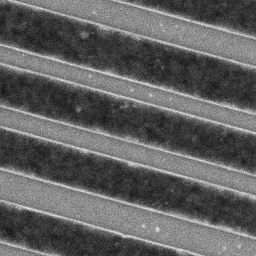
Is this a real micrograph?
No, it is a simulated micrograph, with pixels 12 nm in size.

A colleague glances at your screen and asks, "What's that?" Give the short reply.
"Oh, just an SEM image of one or a few lines or trenches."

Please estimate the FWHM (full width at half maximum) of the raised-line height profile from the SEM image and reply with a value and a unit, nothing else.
497 nm